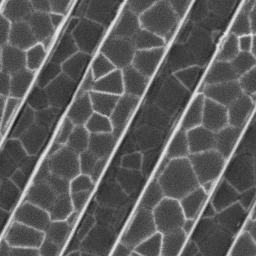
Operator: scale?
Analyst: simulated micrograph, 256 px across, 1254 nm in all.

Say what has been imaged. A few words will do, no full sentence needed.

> one or a few lines or trenches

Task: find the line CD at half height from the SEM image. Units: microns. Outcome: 0.301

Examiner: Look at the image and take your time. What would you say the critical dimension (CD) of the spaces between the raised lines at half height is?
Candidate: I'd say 0.214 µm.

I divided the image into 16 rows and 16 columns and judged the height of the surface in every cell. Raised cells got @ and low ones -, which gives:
@@@@----@@@@---@
@@@@---@@@@---@@
@@@---@@@@@---@@
@@@---@@@@---@@@
@@---@@@@@---@@@
@@---@@@@---@@@@
@---@@@@@---@@@@
@---@@@@---@@@@@
---@@@@@---@@@@-
---@@@@---@@@@@-
--@@@@@---@@@@--
--@@@@---@@@@@--
-@@@@@---@@@@---
-@@@@---@@@@----
@@@@@---@@@@---@
@@@@---@@@@---@@